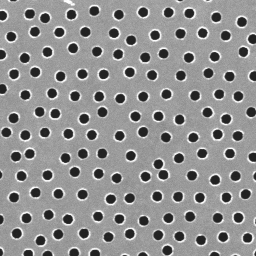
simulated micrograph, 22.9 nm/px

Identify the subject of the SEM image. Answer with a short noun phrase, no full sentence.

a regular array of holes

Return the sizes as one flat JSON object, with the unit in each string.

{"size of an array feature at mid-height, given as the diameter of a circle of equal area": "10 px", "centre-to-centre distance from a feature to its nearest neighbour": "453 nanometres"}